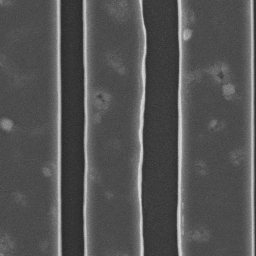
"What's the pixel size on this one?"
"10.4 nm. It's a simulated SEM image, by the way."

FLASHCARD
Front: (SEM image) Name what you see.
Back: one or a few lines or trenches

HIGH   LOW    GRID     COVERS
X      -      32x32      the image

XXXXXXX---XXXXXXXX----XXXXXXXXXX
XXXXXXX---XXXXXXXX-----XXXXXXXXX
XXXXXXX----XXXXXXX-----XXXXXXXXX
XXXXXXX----XXXXXXX-----XXXXXXXXX
XXXXXXX----XXXXXXX-----XXXXXXXXX
XXXXXXX----XXXXXXX-----XXXXXXXXX
XXXXXXX----XXXXXXX-----XXXXXXXXX
XXXXXXX----XXXXXXX-----XXXXXXXXX
XXXXXXX----XXXXXXX-----XXXXXXXXX
XXXXXXX----XXXXXXX-----XXXXXXXXX
XXXXXXX----XXXXXXX----XXXXXXXXXX
XXXXXXX----XXXXXXX----XXXXXXXXXX
XXXXXXX----XXXXXXX----XXXXXXXXXX
XXXXXXX----XXXXXXX----XXXXXXXXXX
XXXXXXX----XXXXXXX-----XXXXXXXXX
XXXXXXX----XXXXXXX----XXXXXXXXXX
XXXXXXX----XXXXXXX----XXXXXXXXXX
XXXXXXX----XXXXXXX----XXXXXXXXXX
XXXXXXX----XXXXXXX----XXXXXXXXXX
XXXXXXX----XXXXXXX----XXXXXXXXXX
XXXXXXX----XXXXXXX----XXXXXXXXXX
XXXXXXX----XXXXXX-----XXXXXXXXXX
XXXXXXX----XXXXXX-----XXXXXXXXXX
XXXXXXX----XXXXXX-----XXXXXXXXXX
XXXXXXX----XXXXXXX----XXXXXXXXXX
XXXXXXX----XXXXXXX----XXXXXXXXXX
XXXXXXX----XXXXXXX----XXXXXXXXXX
XXXXXXX----XXXXXXX----XXXXXXXXXX
XXXXXXXX---XXXXXXX----XXXXXXXXXX
XXXXXXXX---XXXXXXX----XXXXXXXXXX
XXXXXXXX---XXXXXXX----XXXXXXXXXX
XXXXXXXX---XXXXXXX----XXXXXXXXXX